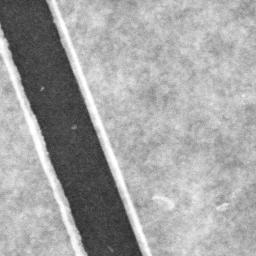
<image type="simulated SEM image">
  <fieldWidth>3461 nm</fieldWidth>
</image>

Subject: one or a few lines or trenches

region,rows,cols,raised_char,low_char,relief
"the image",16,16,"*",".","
...*************
....************
....************
.....***********
*....***********
*....***********
*.....**********
**....**********
**.....*********
***....*********
***....*********
***.....********
****....********
****....********
****.....*******
*****....*******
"